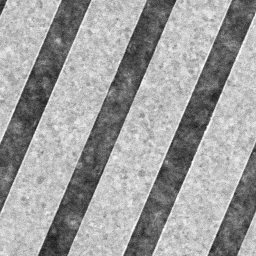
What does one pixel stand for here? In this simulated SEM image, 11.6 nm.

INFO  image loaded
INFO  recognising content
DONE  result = one or a few lines or trenches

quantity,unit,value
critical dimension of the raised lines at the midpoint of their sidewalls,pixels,50.1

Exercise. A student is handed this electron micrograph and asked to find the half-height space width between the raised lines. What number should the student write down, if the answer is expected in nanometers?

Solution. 320